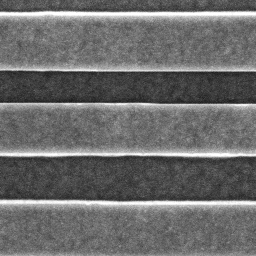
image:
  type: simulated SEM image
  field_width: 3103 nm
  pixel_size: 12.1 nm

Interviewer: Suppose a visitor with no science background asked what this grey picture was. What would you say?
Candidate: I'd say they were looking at lines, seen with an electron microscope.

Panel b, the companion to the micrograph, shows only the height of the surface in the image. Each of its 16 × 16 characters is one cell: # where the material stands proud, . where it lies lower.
................
################
################
################
................
................
#########.......
################
################
################
................
................
................
################
################
################